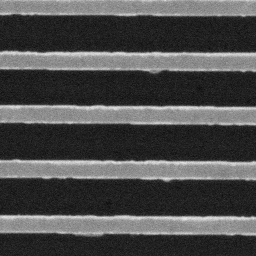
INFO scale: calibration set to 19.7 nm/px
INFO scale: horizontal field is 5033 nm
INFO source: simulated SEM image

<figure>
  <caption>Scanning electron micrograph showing lines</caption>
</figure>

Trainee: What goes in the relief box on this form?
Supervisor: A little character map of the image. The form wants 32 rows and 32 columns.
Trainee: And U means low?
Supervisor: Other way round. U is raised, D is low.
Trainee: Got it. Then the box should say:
UUUUUUUUUUUUUUUUUUUUUUUUUUUUUUUU
UUUUUUUUUUUUUUUUUUUUUUUUUUUUUUUU
DDDDDDDDDDDDDDDDDDDDDDDDDDDDDDDD
DDDDDDDDDDDDDDDDDDDDDDDDDDDDDDDD
DDDDDDDDDDDDDDDDDDDDDDDDDDDDDDDD
DDDDDDDDDDDDDDDDDDDDDDDDDDDDDDDD
UDDDDDDDDDDDDDDDDDDDDDDDDDDDDDDD
UUUUUUUUUUUUUUUUUUUUUUUUUUUUUUUU
UUUUUUUUUUUUUUUUUUUUUUUUUUUUUUUU
DDDDDDDDDDDDDDDDDDDDDDDDDDDDDDDD
DDDDDDDDDDDDDDDDDDDDDDDDDDDDDDDD
DDDDDDDDDDDDDDDDDDDDDDDDDDDDDDDD
DDDDDDDDDDDDDDDDDDDDDDDDDDDDDDDD
UUUUUUUUUUUUUUUUUUUUUUUUUUUUUUUU
UUUUUUUUUUUUUUUUUUUUUUUUUUUUUUUU
DDDDDDDDDDDDDDDDDDDDDDDDDDDUUUUU
DDDDDDDDDDDDDDDDDDDDDDDDDDDDDDDD
DDDDDDDDDDDDDDDDDDDDDDDDDDDDDDDD
DDDDDDDDDDDDDDDDDDDDDDDDDDDDDDDD
DDDDDDDDDDDDDDDDDDDDDDDDDDDDDDDD
UUUUUUUUUUUUUUUUUUUUUUUUUUUUUUUU
UUUUUUUUUUUUUUUUUUUUUUUUUUUUUUUU
DDDDDDDDDDDDDDDDDDDDDDDDDDDDDDDD
DDDDDDDDDDDDDDDDDDDDDDDDDDDDDDDD
DDDDDDDDDDDDDDDDDDDDDDDDDDDDDDDD
DDDDDDDDDDDDDDDDDDDDDDDDDDDDDDDD
DDDDDDDDDDDDDDDDDDDDDDDDDDDDDDDD
UUUUUUUUUUUUUUUUUUUUUUUUUUUUUUUU
UUUUUUUUUUUUUUUUUUUUUUUUUUUUUUUU
DDDDDDDDDDDDDDDDDDDDDDDDDDDDDDDD
DDDDDDDDDDDDDDDDDDDDDDDDDDDDDDDD
DDDDDDDDDDDDDDDDDDDDDDDDDDDDDDDD